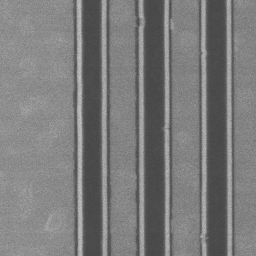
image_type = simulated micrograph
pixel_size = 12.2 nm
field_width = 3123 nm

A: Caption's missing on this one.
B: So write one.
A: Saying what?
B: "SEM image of one or a few lines or trenches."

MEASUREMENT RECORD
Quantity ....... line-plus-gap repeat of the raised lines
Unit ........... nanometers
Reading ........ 760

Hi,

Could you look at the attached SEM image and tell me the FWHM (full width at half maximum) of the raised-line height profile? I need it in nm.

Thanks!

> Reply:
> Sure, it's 314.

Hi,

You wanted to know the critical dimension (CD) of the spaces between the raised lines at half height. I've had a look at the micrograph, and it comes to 455 nm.